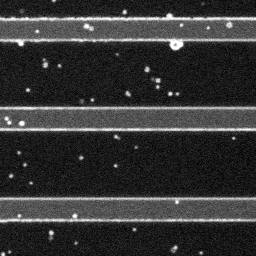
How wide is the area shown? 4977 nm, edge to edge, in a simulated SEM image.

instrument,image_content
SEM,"lines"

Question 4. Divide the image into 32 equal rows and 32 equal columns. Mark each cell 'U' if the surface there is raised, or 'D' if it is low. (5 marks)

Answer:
DDDDDDDDDDDDDDDDDDDDDDDDDDDDDDDD
DDDDDDDDDDDDDDDDDDDDDDDDDDDDDDDD
UUUUUUUUUUUUUUUUUUUUUUUUUUUUUUUU
UUUUUUUUUUUUUUUUUUUUUUUUUUUUUUUU
UUUUUUUUUUUUUUUUUUUUUUUUUUUUUUUU
DDDDDDDDDDDDDDDDDDDDDUUDDDDDDDDD
DDDDDDDDDDDDDDDDDDDDDDDDDDDDDDDD
DDDDDDDDDDDDDDDDDDDDDDDDDDDDDDDD
DDDDDDDDDDDDDDDDDDDDDDDDDDDDDDDD
DDDDDDDDDDDDDDDDDDDDDDDDDDDDDDDD
DDDDDDDDDDDDDDDDDDDDDDDDDDDDDDDD
DDDDDDDDDDDDDDDDDDDDDDDDDDDDDDDD
DDDDDDDDDDDDDDDDDDDDDDDDDDDDDDDD
UUUUUUUUUUUUUUUUUUUUUUUUUUUUUUUU
UUUUUUUUUUUUUUUUUUUUUUUUUUUUUUUU
UUUUUUUUUUUUUUUUUUUUUUUUUUUUUUUU
DDDDDDDDDDDDDDDDDDDDDDDDDDDDDDDD
DDDDDDDDDDDDDDDDDDDDDDDDDDDDDDDD
DDDDDDDDDDDDDDDDDDDDDDDDDDDDDDDD
DDDDDDDDDDDDDDDDDDDDDDDDDDDDDDDD
DDDDDDDDDDDDDDDDDDDDDDDDDDDDDDDD
DDDDDDDDDDDDDDDDDDDDDDDDDDDDDDDD
DDDDDDDDDDDDDDDDDDDDDDDDDDDDDDDD
DDDDDDDDDDDDDDDDDDDDDDDDDDDDDDDD
DDDDDDDDDDDDDDDDDDDDDDDDDDDDDDDD
UUUUUUUUUUUUUUUUUUUUUUUUUUUUUUUU
UUUUUUUUUUUUUUUUUUUUUUUUUUUUUUUU
UUUUUUUUUUUUUUUUUUUUUUUUUUUUUUUU
DDDDDDDDDDDDDDDDDDDDDDDDDDDDDDDD
DDDDDDDDDDDDDDDDDDDDDDDDDDDDDDDD
DDDDDDDDDDDDDDDDDDDDDDDDDDDDDDDD
DDDDDDDDDDDDDDDDDDDDDDDDDDDDDDDD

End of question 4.